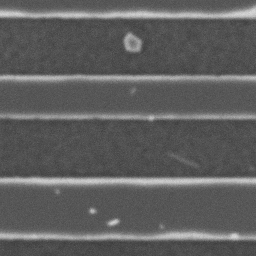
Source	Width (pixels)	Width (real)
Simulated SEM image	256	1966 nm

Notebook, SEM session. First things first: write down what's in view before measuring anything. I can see lines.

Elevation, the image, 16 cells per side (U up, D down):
UUUUUUUUUUUUUUUU
DDDDDDDDDDDDDDDD
DDDDDDDDDDDDDDDD
DDDDDDDDDDDDDDDD
DDDDDDDDDDDDDDDD
UUUUUUUUUUUUUUUU
UUUUUUUUUUUUUUUU
DDDDDDDDDDDDDDDD
DDDDDDDDDDDDDDDD
DDDDDDDDDDDDDDDD
DDDDDDDDDDDDDDDD
UUUUUUUUUUUUUUUU
UUUUUUUUUUUUUUUU
UUUUUUUUUUUUUUUU
UUUUUUUUUUUUUUUU
DDDDDDDDDDDDDDDD